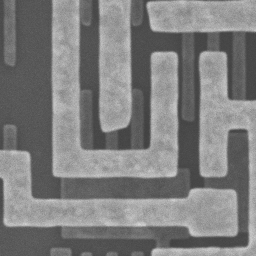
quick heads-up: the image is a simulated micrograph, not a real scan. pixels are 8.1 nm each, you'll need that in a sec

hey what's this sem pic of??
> wiring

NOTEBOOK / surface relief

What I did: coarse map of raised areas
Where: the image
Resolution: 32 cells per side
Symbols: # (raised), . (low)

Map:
.......###..####...#############
.......###..####..##############
.......###..####...#############
.......###..####...#############
.......###..####................
.......###..####................
.......###..####................
.......###..####...###...###....
.......###..####...###...###....
.......###..####...###...###....
.......###..####...###...###....
.......###..####...###...###....
.......###..####...###...####...
.......###..####...###...#######
.......###..####...###...#######
.......###...###...###...#######
.......###.........###...####..#
.......###.........###...###...#
.......###........####...###...#
####...###############...###...#
####...###############...###...#
####...###############...###...#
####...........................#
####...........................#
.###...................#######.#
.#############################.#
.#############################.#
##############################.#
.......................#######.#
........................###.#..#
...............................#
...................#############